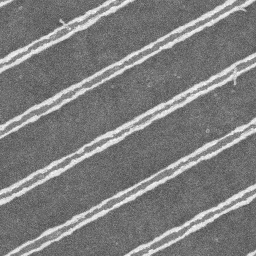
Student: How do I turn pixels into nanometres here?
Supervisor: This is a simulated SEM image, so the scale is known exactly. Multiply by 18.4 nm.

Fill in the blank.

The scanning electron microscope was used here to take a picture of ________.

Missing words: parallel lines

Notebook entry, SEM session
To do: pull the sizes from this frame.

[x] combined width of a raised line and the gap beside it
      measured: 1060 nanometers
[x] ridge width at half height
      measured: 171 nm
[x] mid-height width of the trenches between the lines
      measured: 896 nanometers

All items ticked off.